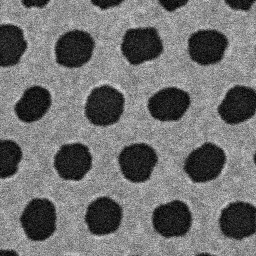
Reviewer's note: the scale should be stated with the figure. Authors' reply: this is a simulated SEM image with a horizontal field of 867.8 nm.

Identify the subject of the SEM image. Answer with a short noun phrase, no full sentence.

a regular array of holes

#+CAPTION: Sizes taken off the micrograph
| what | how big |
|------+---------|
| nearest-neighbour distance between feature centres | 64.2 pixels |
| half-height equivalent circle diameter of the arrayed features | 136 nanometres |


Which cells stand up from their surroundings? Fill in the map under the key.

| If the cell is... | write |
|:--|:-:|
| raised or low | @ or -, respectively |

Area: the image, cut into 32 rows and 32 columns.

@@@---@@@@@@---@@@@@---@@@@@----
@@@@@@@@@@@@@@@@@@@@@@@@@@@@@@@@
@@@@@@@@@@@@@@@@@@@@@@@@@@@@@@@@
---@@@@@@@@@@@@@---@@@@@@@@@@@@@
---@@@@@---@@@@-----@@@@----@@@@
---@@@@-----@@@-----@@@------@@@
---@@@@-----@@@-----@@@-----@@@@
---@@@@----@@@@@---@@@@@----@@@@
-@@@@@@@-@@@@@@@@@@@@@@@@@@@@@@@
@@@@@@@@@@@@@@@@@@@@@@@@@@@@@@@@
@@@@@@@@@@@@@@@@@@@@@@@@@@@@@@@@
@@@---@@@@@----@@@@----@@@@@----
@@----@@@@@-----@@------@@@@----
@@----@@@@@-----@@------@@@-----
@@---@@@@@@----@@@@----@@@@-----
@@@@@@@@@@@---@@@@@@@@@@@@@@@-@@
@@@@@@@@@@@@@@@@@@@@@@@@@@@@@@@@
--@@@@@@@@@@@@@@@@@@@@@@@@@@@@@@
---@@@@----@@@@----@@@@@----@@@@
---@@@@----@@@@-----@@@-----@@@@
--@@@@@----@@@@-----@@@-----@@@@
--@@@@@----@@@@----@@@@-----@@@@
@@@@@@@@--@@@@@@---@@@@@---@@@@@
@@@@@@@@@@@@@@@@@@@@@@@@@@@@@@@@
@@@@@@@@@@@@-@@@@@@@@@@@@@@@@@@@
@@@----@@@@----@@@@@---@@@@@@---
@@@----@@@@----@@@@-----@@@-----
@@-----@@@@----@@@@-----@@@-----
@@@----@@@@----@@@@-----@@@-----
@@@----@@@@@-@@@@@@@---@@@@@---@
@@@@@@@@@@@@@@@@@@@@@@@@@@@@@@@@
--@@@@@@@@@@@@@@@@@@@@@@@@@@@@@@